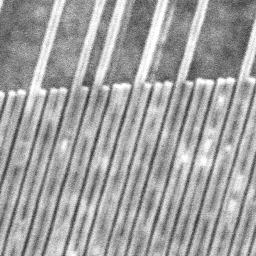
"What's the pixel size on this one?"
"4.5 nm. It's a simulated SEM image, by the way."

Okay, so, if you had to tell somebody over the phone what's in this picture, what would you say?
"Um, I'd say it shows parallel lines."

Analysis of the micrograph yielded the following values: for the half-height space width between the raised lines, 16.8 nm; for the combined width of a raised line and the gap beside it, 9.89 pixels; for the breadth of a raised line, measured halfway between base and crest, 33 nanometres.